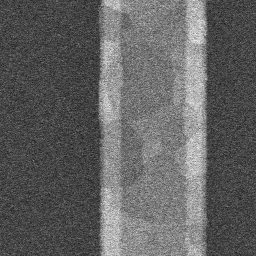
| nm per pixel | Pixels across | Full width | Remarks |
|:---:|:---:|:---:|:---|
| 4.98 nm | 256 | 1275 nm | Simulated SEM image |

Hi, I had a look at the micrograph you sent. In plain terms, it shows one or a few lines or trenches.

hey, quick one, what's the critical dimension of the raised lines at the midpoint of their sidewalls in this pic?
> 83.6 pixels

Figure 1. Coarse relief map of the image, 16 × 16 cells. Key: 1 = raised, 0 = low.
0000000111110000
0000000111110000
0000000111110000
0000000111110000
0000000111110000
0000000111110000
0000000111110000
0000000111110000
0000000111110000
0000000111110000
0000000111110000
0000000111110000
0000000111110000
0000000111110000
0000000111110000
0000000111110000